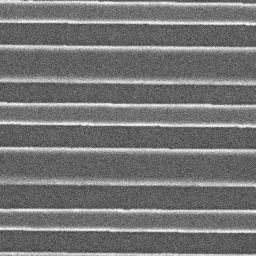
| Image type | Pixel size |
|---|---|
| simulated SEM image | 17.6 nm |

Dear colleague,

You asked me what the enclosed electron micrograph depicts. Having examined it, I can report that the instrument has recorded lines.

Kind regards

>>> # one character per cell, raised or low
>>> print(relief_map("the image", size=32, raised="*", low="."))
******************************..
********************************
********************************
................................
................................
................................
********************************
********************************
********************************
********************************
................................
................................
................................
********************************
********************************
...*****************************
................................
................................
................................
********************************
********************************
********************************
********************************
................................
................................
................................
********************************
********************************
********************************
................................
................................
................................